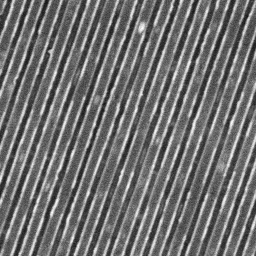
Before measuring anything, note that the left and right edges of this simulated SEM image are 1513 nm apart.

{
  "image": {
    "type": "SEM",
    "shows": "parallel lines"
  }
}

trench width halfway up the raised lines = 6.02 pixels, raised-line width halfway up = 67 nanometres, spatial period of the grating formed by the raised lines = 0.104 um